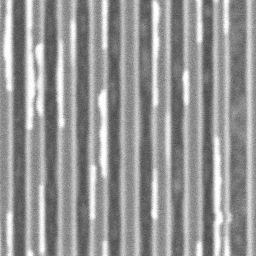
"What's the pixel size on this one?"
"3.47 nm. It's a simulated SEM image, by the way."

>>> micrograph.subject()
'parallel lines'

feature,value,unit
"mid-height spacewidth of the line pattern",0.0516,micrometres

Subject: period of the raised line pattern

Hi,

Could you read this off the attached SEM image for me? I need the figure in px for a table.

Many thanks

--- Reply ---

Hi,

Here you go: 31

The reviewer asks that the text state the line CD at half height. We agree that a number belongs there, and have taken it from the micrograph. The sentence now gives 55.1 nm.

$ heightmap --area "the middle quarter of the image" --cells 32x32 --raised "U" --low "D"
UUDDDDDUUUUDDDDUUUDDDDUUUUDDDDUU
UUDDDDDUUUUDDDDUUUDDDDUUUUDDDDUU
UUDDDDDUUUUDDDDUUUDDDDUUUUDDDDUU
UUDDDDDUUUDDDDDUUUDDDDUUUUDDDDUU
UUDDDDDUUUDDDDDUUUDDDDUUUUDDDDUU
UUDDDDDUUUDDDDDUUUDDDDUUUUDDDDUU
UUDDDDDUUUDDDDDUUUDDDDUUUUDDDDUU
UUDDDDDUUUDDDDDUUUDDDDUUUUDDDDUU
UUDDDDDUUUUDDDDUUUDDDDUUUUDDDDUU
UUDDDDDUUUUDDDDUUUDDDDUUUUDDDDUU
UUDDDDDUUUUDDDDUUUDDDDUUUUDDDDUU
UUDDDDDUUUUDDDDUUUDDDDUUUUDDDDUU
UUDDDDDUUUUDDDDUUUDDDDUUUUDDDDUU
UUUDDDDUUUUDDDDUUUDDDDUUUUDDDDUU
UUUDDDDUUUUDDDDUUUDDDDUUUUDDDDUU
UUUDDDDUUUUDDDDUUUDDDDUUUUDDDDUU
UUUDDDDUUUUDDDDUUUDDDDUUUUDDDDUU
UUUDDDDUUUUDDDDUUUDDDDUUUUDDDDUU
UUUDDDDUUUUDDDDUUUDDDDDUUUDDDDUU
UUUDDDDUUUUDDDDUUUDDDDDUUUDDDDUU
UUUDDDDUUUUDDDDUUUDDDDDUUUDDDDUU
UUUDDDDUUUUDDDDUUUDDDDDUUUDDDDUU
UUUDDDDUUUUDDDDUUUDDDDDUUUDDDDUU
UUUDDDDUUUUDDDDUUUDDDDDUUUDDDDUU
UUUDDDDUUUUDDDDUUUDDDDDUUUDDDDUU
UUUDDDDUUUUDDDDUUUDDDDDUUUDDDDUU
UUUDDDDUUUUDDDDUUUDDDDDUUUDDDDUU
UUUDDDDUUUUDDDDUUUDDDDDUUUDDDDUU
UUUDDDDUUUUDDDDUUUDDDDDUUUDDDDUU
UUUDDDDUUUUDDDDUUUDDDDUUUUDDDDUU
UUUDDDDUUUUDDDDUUUDDDDUUUUDDDDUU
UUUDDDDUUUUDDDDUUUDDDDUUUUDDDDUU